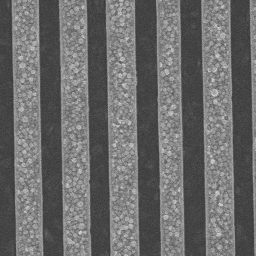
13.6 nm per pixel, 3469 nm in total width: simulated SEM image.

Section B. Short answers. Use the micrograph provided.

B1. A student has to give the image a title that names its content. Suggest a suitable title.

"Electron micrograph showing parallel lines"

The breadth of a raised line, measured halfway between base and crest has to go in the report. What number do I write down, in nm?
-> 366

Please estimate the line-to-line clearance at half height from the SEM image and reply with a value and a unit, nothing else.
286 nanometers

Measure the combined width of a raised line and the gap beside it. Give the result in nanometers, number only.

646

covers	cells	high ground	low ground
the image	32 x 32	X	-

--XXX--XXXX--XXXX---XX---XXXX--X
--XXX--XXXX--XXXX---XX---XXXX--X
--XXX---XXX--XXXX---XX---XXXX--X
--XXX---XXX--XXXX---XX---XXXX--X
--XXX---XXX--XXXX---XX---XXXX--X
--XXX---XXX--XXXX---XXX--XXXX--X
--XXX---XXX--XXXX---XXX--XXXX--X
--XXX---XXX--XXXX---XXX--XXXX---
--XXX---XXX---XXX---XXX--XXXX---
--XXX---XXX---XXX---XXX--XXXX---
--XXX---XXX---XXX---XXX--XXXX---
--XXX---XXX---XXX---XXX--XXXX---
--XXX---XXX---XXX---XXX--XXXX---
--XXX---XXX---XXX---XXX---XXX---
--XXX---XXX---XXX---XXX---XXX---
--XXX---XXX---XXX---XXX---XXX---
--XXX---XXX---XXX---XXX---XXX---
--XXX---XXX---XXX---XXX---XXX---
--XXX---XXX---XXX---XXX---XXX---
--XXX---XXX---XXX---XXX---XXX---
--XXX---XXX---XXX---XXX---XXX---
--XXX---XXX---XXX---XXX---XXX---
--XXX---XXX---XXX---XXX---XXX---
--XXX---XXX---XXX---XXX---XXX---
--XXX---XXX---XXX---XXX---XXX---
--XXX---XXX---XXX---XXX---XXX---
--XXX---XXX---XXX---XXX---XXX---
--XXX---XXX---XXX---XXX---XXX---
--XXX---XXX---XXX---XXX---XXX---
--XXX---XXX---XXX---XXX---XXX---
--XXX---XXX---XXX---XXX---XXX---
--XXX---XXX---XXX---XXX---XXX---